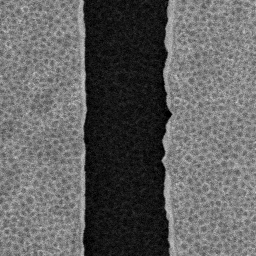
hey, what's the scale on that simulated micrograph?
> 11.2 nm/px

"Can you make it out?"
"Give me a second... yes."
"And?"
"one or a few lines or trenches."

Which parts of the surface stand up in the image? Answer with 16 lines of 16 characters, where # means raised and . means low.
#####......#####
#####......#####
#####......#####
#####......#####
#####.....######
#####.....######
#####.....######
#####......#####
#####.....######
#####.....######
#####.....######
#####......#####
#####.....######
#####......#####
#####......#####
#####......#####